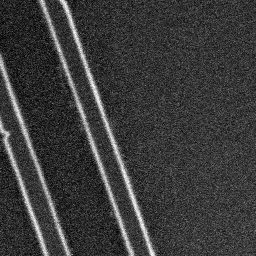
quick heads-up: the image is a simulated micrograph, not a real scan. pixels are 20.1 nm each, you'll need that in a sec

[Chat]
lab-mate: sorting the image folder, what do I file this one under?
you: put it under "one or a few lines or trenches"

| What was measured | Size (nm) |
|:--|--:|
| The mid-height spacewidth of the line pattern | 1210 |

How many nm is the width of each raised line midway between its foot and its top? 396